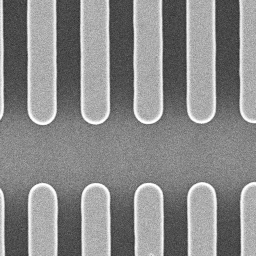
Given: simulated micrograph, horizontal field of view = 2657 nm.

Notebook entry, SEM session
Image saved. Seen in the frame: groups of lines, slits or small figures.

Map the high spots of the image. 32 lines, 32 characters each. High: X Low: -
---XXXX---XXXX---XXX---XXXX---XX
---XXXX---XXXX---XXX---XXXX---XX
---XXXX---XXXX---XXX---XXXX---XX
---XXXX---XXXX---XXX---XXXX---XX
---XXXX---XXXX---XXX---XXXX---XX
---XXXX---XXXX---XXX---XXXX---XX
----XXX---XXXX---XXX---XXXX---XX
----XXX---XXXX---XXX---XXXX---XX
----XXX---XXXX---XXX---XXXX---XX
----XXX---XXXX---XXX---XXXX---XX
----XXX---XXXX---XXX---XXXX---XX
----XXX---XXXX---XXX---XXXX---XX
----XXX---XXXX---XXX---XXXX---XX
----XXX---XXXX---XXX---XXXX---XX
----XXX---XXX----XXX----XXX---XX
--------------------------------
--------------------------------
--------------------------------
--------------------------------
--------------------------------
--------------------------------
--------------------------------
--------------------------------
----XX-----XX----XXX----XXX----X
----XXX---XXXX---XXX----XXX---XX
----XXX---XXXX---XXX----XXX---XX
----XXX---XXXX---XXX----XXX---XX
----XXX---XXXX---XXX----XXX---XX
----XXX---XXXX---XXX----XXX---XX
----XXX---XXXX---XXX----XXX---XX
----XXX---XXXX---XXX----XXX---XX
----XXX---XXXX---XXX----XXX---XX